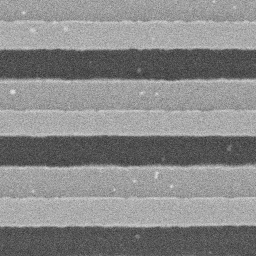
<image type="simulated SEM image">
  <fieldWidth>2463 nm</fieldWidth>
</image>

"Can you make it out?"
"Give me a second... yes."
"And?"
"lines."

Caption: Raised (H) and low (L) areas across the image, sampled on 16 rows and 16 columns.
HHHHHHHHHHHHHHHH
HHHHHHHHHHHHHHHH
HHHHHHHHHHHHHHHH
LLLLLLLLLLLLLLLL
LLLLLLLLLLLLLLLL
HHHHHHHHHHHHHHHH
HHHHHHHHHHHHHHHH
HHHHHHHHHHHHHHHH
LLLLLLLLLLLLLLLL
LLLLLLLLLLLLLLLL
HHHHHHHHHHHHHHHH
HHHHHHHHHHHHHHHH
HHHHHHHHHHHHHHHH
HHHHHHHHHHHHHHHH
LLLLLLLLLLLLLLLL
LLLLLLLLLLLLLLLL